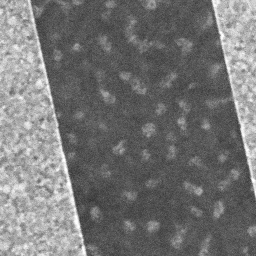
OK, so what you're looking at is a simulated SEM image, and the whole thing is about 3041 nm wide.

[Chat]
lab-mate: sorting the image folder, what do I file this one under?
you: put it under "one or a few lines or trenches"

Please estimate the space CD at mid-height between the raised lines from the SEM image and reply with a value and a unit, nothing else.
2.13 um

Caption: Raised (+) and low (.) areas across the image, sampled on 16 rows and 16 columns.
++...........+++
++............++
++............++
+++...........++
+++...........++
+++............+
+++............+
+++............+
++++...........+
++++...........+
++++............
++++............
+++++...........
+++++...........
+++++...........
+++++...........